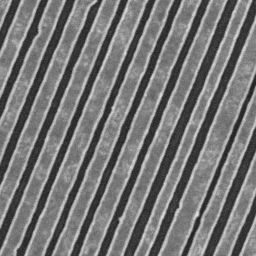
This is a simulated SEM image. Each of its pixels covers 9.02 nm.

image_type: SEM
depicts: parallel lines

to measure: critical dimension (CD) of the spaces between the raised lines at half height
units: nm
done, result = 92.9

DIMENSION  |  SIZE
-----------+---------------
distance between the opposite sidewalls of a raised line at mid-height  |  126 nm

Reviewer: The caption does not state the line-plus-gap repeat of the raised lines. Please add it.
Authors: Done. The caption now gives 225 nm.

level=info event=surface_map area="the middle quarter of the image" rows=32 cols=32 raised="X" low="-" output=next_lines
---XXXX---XXXX---XXXX--XXXX---XX
---XXXX--XXXXX--XXXX---XXXX---XX
--XXXX---XXXX---XXXX--XXXX---XXX
--XXXX--XXXXX--XXXX---XXXX---XXX
--XXX---XXXX---XXXX---XXXX--XXXX
-XXXX---XXXX---XXX---XXXX---XXXX
-XXXX--XXXXX--XXXX---XXXX---XXX-
XXXX---XXXX---XXXX--XXXXX--XXXX-
XXXX--XXXXX--XXXX---XXXX---XXXX-
XXX---XXXX---XXXX---XXXX--XXXX--
XXX--XXXXX---XXX---XXXX---XXXX--
XXX--XXXXX--XXXX---XXXX--XXXX---
XX---XXXX---XXXX--XXXX---XXXX---
XX--XXXXX--XXXX---XXXX---XXXX---
X---XXXX---XXXX--XXXXX--XXXX----
X--XXXXX--XXXX---XXXX---XXXX---X
X--XXXXX--XXXX---XXXX--XXXX----X
---XXXX---XXXX--XXXX---XXXX---XX
--XXXXX--XXXX---XXXX---XXX----XX
--XXXX---XXXX--XXXXX--XXXX---XXX
-XXXXX--XXXX---XXXX---XXXX---XXX
-XXXX---XXXX---XXXX--XXXX----XXX
-XXXX---XXXX--XXXX---XXXX---XXX-
XXXXX--XXXX---XXXX---XXXX---XXX-
XXXX---XXXX--XXXXX--XXXX---XXX--
XXXX--XXXX---XXXX---XXXX---XXX--
XXX---XXXX---XXXX--XXXX----XXX--
XXX--XXXX---XXXX---XXXX---XXX---
XXX--XXXX---XXXX---XXX----XXX---
XX---XXXX--XXXXX--XXXX---XXX---X
XX--XXXX---XXXX---XXXX---XXX---X
X---XXXX---XXXX--XXXX----XXX---X